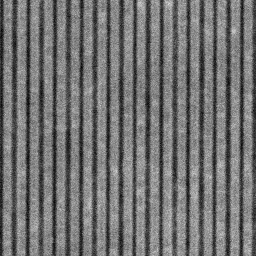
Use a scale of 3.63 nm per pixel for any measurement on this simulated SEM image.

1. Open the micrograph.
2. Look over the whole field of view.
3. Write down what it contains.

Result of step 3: parallel lines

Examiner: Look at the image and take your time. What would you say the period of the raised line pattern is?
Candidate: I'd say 48.5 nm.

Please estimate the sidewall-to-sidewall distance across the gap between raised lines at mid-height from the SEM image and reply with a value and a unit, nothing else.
18.1 nanometers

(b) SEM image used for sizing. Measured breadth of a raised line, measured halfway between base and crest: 29.9 nanometres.